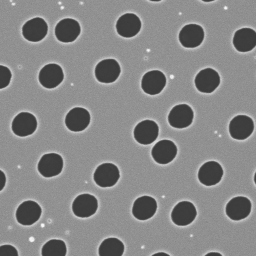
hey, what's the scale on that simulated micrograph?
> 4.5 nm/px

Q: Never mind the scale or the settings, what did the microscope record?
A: a regular array of holes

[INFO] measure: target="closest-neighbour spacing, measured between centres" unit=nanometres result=202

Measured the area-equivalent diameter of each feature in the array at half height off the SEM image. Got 110 nanometres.